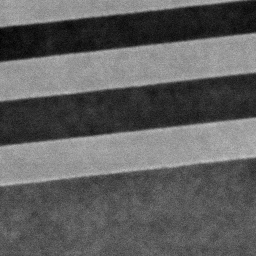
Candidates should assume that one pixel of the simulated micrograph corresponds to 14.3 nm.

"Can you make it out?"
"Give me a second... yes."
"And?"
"lines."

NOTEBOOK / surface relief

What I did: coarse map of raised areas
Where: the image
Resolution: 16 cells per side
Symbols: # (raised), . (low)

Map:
###########.....
##..............
............####
...#############
################
#######.........
................
...............#
......##########
################
##########......
#...............
................
................
................
................